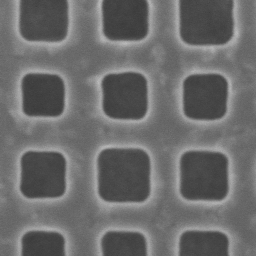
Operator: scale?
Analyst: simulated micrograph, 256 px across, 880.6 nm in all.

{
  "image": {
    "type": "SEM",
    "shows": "holes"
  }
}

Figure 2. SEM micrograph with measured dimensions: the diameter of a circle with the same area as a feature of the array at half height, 172 nanometers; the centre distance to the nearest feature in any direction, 273 nanometres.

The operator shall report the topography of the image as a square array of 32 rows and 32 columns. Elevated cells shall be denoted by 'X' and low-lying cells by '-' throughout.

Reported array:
XX-------XXXX-----XXXX-------XXX
XX-------XXXX------XXX-------XXX
XX-------XXXX------XXX-------XXX
XX-------XXXX------XXX-------XXX
XXX-----XXXXX-----XXXXX------XXX
XXXXXXXXXXXXXXXXXXXXXXX-----XXXX
XXXXXXXXXXXXXXXXXXXXXXXXXXXXXXXX
XXXXXXXXXXXXXXXXXXXXXXXXXXXXXXXX
XXXXXXXXXXXXXXXXXXXXXXXXXXXXXXXX
XXX----XXXXXX-----XXXXXX----XXXX
XXX-----XXXXX-----XXXXX-----XXXX
XXX-----XXXXX-----XXXXX-----XXXX
XXX-----XXXXX-----XXXXX-----XXXX
XXX-----XXXXX-----XXXXX-----XXXX
XXXX---XXXXXXX----XXXXX-----XXXX
XXXXXXXXXXXXXXXXXXXXXXXXXXXXXXXX
XXXXXXXXXXXXXXXXXXXXXXXXXXXXXXXX
XXXXXXXXXXXXXXXXXXXXXXXXXXXXXXXX
XXXXXXXXXXXXXXXXXXXXXXXXXXXXXXXX
XXX-----XXXX-------XXXX-----XXXX
XXX-----XXXX-------XXX------XXXX
XXX-----XXXX-------XXX------XXXX
XX------XXXX-------XXX------XXXX
XX------XXXX-------XXX-------XXX
XXX-----XXXXX------XXXX-----XXXX
XXXXXXXXXXXXXXXXXXXXXXXXXXXXXXXX
XXXXXXXXXXXXXXXXXXXXXXXXXXXXXXXX
XXXXXXXXXXXXXXXXXXXXXXXXXXXXXXXX
XXXXXXXXXXXXXXXXXXXXXXXXXXXXXXXX
XXX-----XXXXX-----XXXXX-----XXXX
XXX-----XXXXX-----XXXX-------XXX
XXX-----XXXXX-----XXXX-------XXX